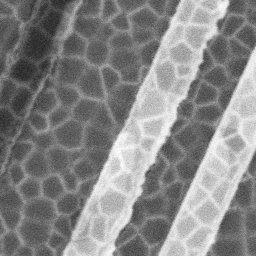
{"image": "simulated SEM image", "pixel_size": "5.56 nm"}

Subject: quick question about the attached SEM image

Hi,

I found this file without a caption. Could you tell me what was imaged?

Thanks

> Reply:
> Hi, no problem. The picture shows one or a few lines or trenches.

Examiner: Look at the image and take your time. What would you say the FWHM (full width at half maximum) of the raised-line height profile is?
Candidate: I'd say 221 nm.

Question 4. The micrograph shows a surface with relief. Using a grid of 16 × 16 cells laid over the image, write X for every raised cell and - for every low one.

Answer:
--XXX------XXX--
--XX-------XXX--
-XXX------XXX---
-XX-------XXX---
XXX------XXX---X
XXX------XXX---X
XX------XXX---XX
XX------XXX---XX
X-------XX---XXX
X------XXX---XXX
-------XX----XX-
------XXX---XXX-
------XX----XX--
-----XXX---XXX--
-----XX----XX---
----XXX---XXX---